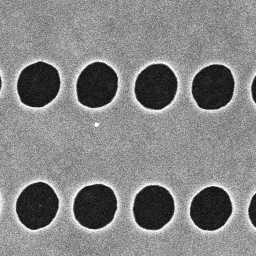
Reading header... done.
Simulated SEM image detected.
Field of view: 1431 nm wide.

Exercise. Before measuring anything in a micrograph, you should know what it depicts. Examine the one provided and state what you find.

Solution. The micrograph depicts a regular array of holes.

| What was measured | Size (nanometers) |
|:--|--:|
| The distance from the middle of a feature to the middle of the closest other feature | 322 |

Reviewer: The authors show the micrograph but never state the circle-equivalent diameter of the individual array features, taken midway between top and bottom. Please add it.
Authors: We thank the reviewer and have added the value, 0.249 µm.